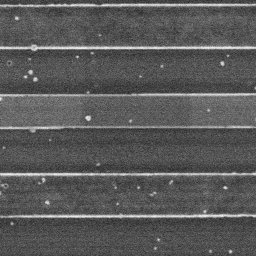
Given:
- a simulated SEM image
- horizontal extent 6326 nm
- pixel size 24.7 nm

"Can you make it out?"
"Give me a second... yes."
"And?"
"lines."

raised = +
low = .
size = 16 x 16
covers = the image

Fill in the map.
++++++++++++++++
++++++++++++++++
++++++++++++++++
................
................
................
++++++++++++++++
++++++++++++++++
................
................
................
++++++++++++++++
++++++++++++++++
++++++++........
................
................